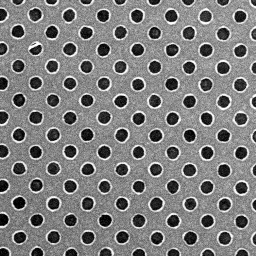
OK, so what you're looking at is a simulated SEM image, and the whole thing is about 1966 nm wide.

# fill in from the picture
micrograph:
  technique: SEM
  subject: a regular array of holes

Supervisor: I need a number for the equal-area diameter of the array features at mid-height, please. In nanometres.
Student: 101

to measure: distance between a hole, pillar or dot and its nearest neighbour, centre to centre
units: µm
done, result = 0.182